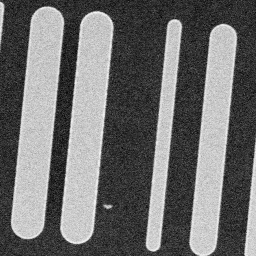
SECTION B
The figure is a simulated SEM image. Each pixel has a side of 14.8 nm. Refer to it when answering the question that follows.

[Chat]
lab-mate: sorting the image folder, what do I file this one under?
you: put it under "groups of lines, slits or small figures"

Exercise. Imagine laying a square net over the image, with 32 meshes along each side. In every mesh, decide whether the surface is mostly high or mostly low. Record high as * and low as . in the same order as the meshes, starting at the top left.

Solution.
................................
....***.........................
....****..****..................
....****..****.......**....**...
....****..****.......**...***...
....****..****.......**...***...
....****..****.......*....***...
...****...****.......*....***...
...****...****......**....***...
...****..****.......**....***...
...****..****.......**....***...
...****..****.......**....***...
...****..****.......**....***...
...****..****.......**...****...
...****..****.......**...****...
...****..****.......*....****...
...****..****.......*....***....
..*****..****.......*....***....
..****...****.......*....***....
..****..*****......**....***....
..****..****.......**....***....
..****..****.......**....***....
..****..****.......**....***....
..****..****.......**...****...*
..****..****.......**...****...*
..****..****.......*....***....*
..****..****.......*....***....*
.*****..****.......*....***....*
..***...****......**....***....*
..**....***.......**....***....*
..................**....***....*
........................**.....*